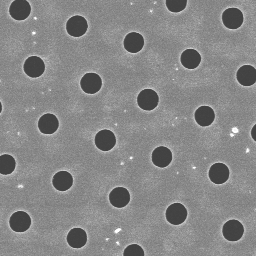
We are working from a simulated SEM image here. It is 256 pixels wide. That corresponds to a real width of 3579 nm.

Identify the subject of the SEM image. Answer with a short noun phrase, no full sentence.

a regular array of holes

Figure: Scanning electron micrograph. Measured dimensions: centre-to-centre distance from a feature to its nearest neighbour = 0.821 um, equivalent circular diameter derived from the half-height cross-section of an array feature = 299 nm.